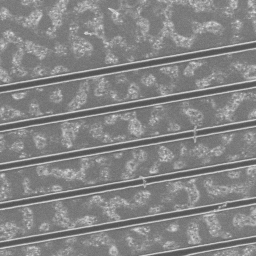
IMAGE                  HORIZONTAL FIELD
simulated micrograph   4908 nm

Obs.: parallel lines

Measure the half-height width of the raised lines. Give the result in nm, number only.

130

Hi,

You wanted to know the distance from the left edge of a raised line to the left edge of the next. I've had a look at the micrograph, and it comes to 0.736 microns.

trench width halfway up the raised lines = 595 nanometres